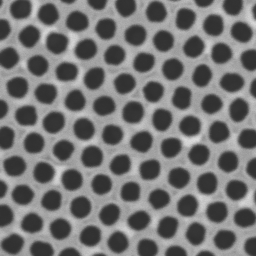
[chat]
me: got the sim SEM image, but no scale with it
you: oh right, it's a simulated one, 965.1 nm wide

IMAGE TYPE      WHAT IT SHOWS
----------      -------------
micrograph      a regular array of holes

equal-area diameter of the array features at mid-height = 79.2 nanometres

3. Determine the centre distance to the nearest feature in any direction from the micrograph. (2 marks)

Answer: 109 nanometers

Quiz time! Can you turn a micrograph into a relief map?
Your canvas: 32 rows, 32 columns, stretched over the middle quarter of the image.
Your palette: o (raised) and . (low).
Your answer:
...oooooooooooooo.....ooo.....oo
...ooo....oooooooo....oo......oo
...oo.....oooo..ooooooooo....ooo
...oo.....ooo....ooooooooo..oooo
ooooo.....oo......ooo..ooooooooo
oooooo...oooo.....oo.....ooooooo
ooo.ooo.ooooo....ooo.....ooo...o
o....ooooooooo.ooooo.....oo.....
.....ooo....oooooooo....ooo.....
.....oo......oooo.oooo.oooo.....
o....oo......oo.....oooooooo...o
oo..ooo......oo.....ooo..ooooooo
oooooooo...oooo.....oo.....ooooo
ooooooooooooooo....ooo.....ooo..
ooo....ooooooooo...ooo.....oo...
oo.....oooo..ooooooooo....ooo...
oo......oo....ooooooooo...ooo...
ooo....ooo.....ooo....oooooooo..
oooo...oo......oo.....oooo..oooo
..oooooooo....ooo.....ooo....ooo
..oooo..ooooooooo.....oo.....ooo
...oo....ooooooooo...ooo.....ooo
..oo......ooooooooooooooo...ooo.
.ooo......oo....ooooooooooooooo.
ooooo....ooo.....ooo....oooooooo
ooooo....oo......oo.....oooooooo
o..ooooooooo....ooo.....ooo...oo
....ooooooooo..oooo.....oo.....o
.....oo....ooooooooo...ooo......
.....oo.....oooo.ooooooooo.....o
....ooo.....ooo....oooooooo...oo
o..oooo.....oo.....oooo..ooooooo